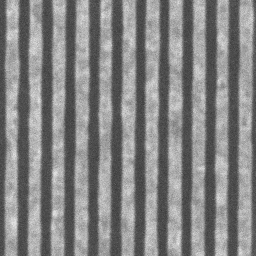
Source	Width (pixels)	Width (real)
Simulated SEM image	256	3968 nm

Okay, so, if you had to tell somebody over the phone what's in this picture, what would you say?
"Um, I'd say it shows wiring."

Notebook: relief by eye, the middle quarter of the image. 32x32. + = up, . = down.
...+++...+++...+++...+++...++...
...+++...+++...+++...+++...++...
...+++...+++...+++...++....++...
...+++...+++...+++...++....++...
...+++...+++...+++...++....++...
...+++...+++...+++...++....++...
...+++...+++...+++...++....++...
...+++...+++...+++...++....++...
...+++...+++...+++...+++...++...
...+++...+++...+++...+++...++...
...+++...+++...+++...+++...++...
...+++...+++...+++...++....++...
...+++...+++...+++...++...+++...
...+++...+++...+++...++...+++...
...+++...+++...+++...++....++...
...+++...+++...+++...++....++...
...+++...+++...+++...++....++...
...+++...+++...++....++....++...
...+++...++....++....++...+++...
...+++...++....+++...++...+++...
...+++...++....+++...++...+++...
...+++...++....+++...++...+++...
...+++...+++...+++...++...+++...
...+++...+++...++....++...+++...
...+++...+++...++....++...+++...
...+++...+++...++....++...+++...
...+++...+++...++....++...+++...
...+++...+++...++....++...+++...
...+++...+++...++....++...+++...
...+++...+++...++....++...+++...
...+++...+++...++....++...+++...
...+++...+++...++....++...+++...